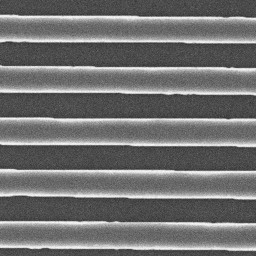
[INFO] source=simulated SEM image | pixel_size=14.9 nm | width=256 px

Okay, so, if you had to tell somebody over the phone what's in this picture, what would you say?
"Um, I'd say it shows lines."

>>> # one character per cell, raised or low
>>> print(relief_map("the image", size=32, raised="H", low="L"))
LLLLLLLLLLLLLLLLLLLLLLLLLLLLLLLL
LLLLLLLLLLLLLLLLLLLLLLLLLLLLLLLL
HHHHHHHHHHHHHHHHHHHHHHHHHHHHHHHH
HHHHHHHHHHHHHHHHHHHHHHHHHHHHHHHH
HHHHHHHHHHHHHHHHHHHHHHHHHHHHHHHH
LLLLLLLLLLLLLLLLLLLLLLLLLLLLLLLL
LLLLLLLLLLLLLLLLLLLLLLLLLLLLLLLL
LLLLLLLLLLLLLLLLLLLLLLLLLLLLLLLL
HHHHHHHHHHHHHHHHHHHHHHHHHHHLLLLL
HHHHHHHHHHHHHHHHHHHHHHHHHHHHHHHH
HHHHHHHHHHHHHHHHHHHHHHHHHHHHHHHH
LHHHHHHHHHHHHHHHHHHHHHHHHHHHHHHH
LLLLLLLLLLLLLLLLLLLLLLLLLLLLLLLL
LLLLLLLLLLLLLLLLLLLLLLLLLLLLLLLL
LLLLLLLLLLLLLLLLLLLLLLLLLLLLLLLL
HHHHHHHHHHHHHHHHHHHHHHHHHHHHHHHH
HHHHHHHHHHHHHHHHHHHHHHHHHHHHHHHH
HHHHHHHHHHHHHHHHHHHHHHHHHHHHHHHH
LLLLLLLLLLLLLLLLLLLLLLLLLLLLLLLL
LLLLLLLLLLLLLLLLLLLLLLLLLLLLLLLL
LLLLLLLLLLLLLLLLLLLLLLLLLLLLLLLL
HHHHHHHHHHHHHHHHHHHHHHHHHHHHHHHH
HHHHHHHHHHHHHHHHHHHHHHHHHHHHHHHH
HHHHHHHHHHHHHHHHHHHHHHHHHHHHHHHH
LLLLLLLLLLLHHHHHHHHHHHHHHHHHHHHH
LLLLLLLLLLLLLLLLLLLLLLLLLLLLLLLL
LLLLLLLLLLLLLLLLLLLLLLLLLLLLLLLL
LLLLLLLLLLLLLLLLLLLLLLLLLLLLLLLL
HHHHHHHHHHHHHHHHHHHHHHHHHHHHHHHH
HHHHHHHHHHHHHHHHHHHHHHHHHHHHHHHH
HHHHHHHHHHHHHHHHHHHHHHHHHHHHHHHH
LLLLLLLLLLLLLLLLLLLLLLLLLLLLLLLL